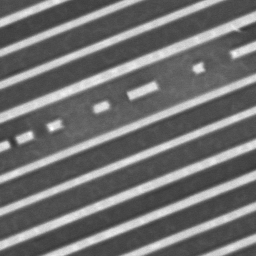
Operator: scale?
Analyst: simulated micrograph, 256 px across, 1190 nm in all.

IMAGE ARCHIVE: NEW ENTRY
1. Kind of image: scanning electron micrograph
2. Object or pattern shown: parallel lines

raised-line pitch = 0.138 µm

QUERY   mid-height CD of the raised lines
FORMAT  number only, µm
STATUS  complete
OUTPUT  0.0421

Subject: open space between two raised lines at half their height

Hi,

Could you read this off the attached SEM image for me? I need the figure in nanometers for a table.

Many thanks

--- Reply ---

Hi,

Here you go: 92.9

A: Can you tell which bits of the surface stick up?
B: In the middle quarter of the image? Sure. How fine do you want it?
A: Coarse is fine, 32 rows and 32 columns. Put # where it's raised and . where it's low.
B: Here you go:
.............#######............
..........########..............
........#######.................
.....########...................
...#######............#.........
########...........####.........
#####............######.........
###.............#####...........
................##..............
.........##...................##
.......####................#####
.......####..............######.
......................######....
....................#####.......
..................#####.........
...............#####............
............######..............
.........######...............##
.......######...............####
....######...............######.
..######...............#####....
#####...............######......
###...............#####.........
...............######...........
.............#####..............
..........######...............#
........######..............####
.....######...............######
...#####...............#######..
######...............######.....
###...............#######.......
#...............#######.........